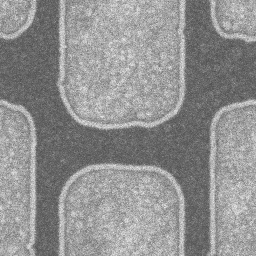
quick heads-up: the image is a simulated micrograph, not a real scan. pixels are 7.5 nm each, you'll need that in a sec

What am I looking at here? one or a few lines or trenches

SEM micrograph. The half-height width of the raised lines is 239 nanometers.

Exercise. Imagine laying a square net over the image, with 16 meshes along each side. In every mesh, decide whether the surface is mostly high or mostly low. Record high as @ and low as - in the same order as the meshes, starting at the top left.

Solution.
--@@-------@@---
--@@-------@@---
@@@@-------@@@@@
@@@@-------@@@@@
@@@@-------@@@@@
@@@@-------@@@@@
@@@@-------@@@@-
--@@@-----@@@@--
--@@@@@@@@@@@---
--@@@@@@@@@@@---
--@@@@--@@@@@---
--@@-------@@---
--@@-------@@---
--@@-------@@---
--@@-------@@---
--@@-------@@---